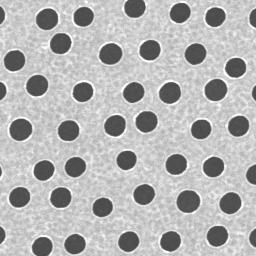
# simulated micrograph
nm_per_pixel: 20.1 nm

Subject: a regular array of holes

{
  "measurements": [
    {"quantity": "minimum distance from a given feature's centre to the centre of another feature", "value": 728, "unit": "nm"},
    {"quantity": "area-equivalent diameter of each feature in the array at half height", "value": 434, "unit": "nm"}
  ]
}